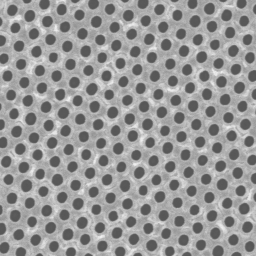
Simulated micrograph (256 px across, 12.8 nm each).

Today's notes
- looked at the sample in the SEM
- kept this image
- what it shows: a regular array of holes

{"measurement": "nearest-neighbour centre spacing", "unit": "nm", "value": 229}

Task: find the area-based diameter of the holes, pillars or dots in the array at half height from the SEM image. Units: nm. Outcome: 139